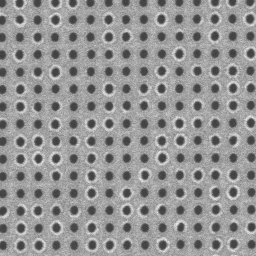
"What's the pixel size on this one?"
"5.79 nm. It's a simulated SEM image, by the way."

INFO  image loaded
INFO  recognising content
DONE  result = a regular array of holes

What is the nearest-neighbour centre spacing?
0.0994 µm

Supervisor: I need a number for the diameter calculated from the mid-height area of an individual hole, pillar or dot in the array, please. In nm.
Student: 48